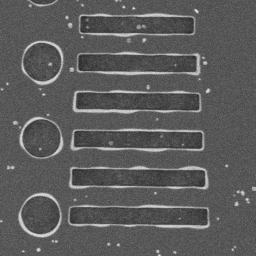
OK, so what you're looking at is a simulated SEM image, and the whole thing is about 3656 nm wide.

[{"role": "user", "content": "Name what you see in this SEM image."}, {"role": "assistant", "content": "groups of lines, slits or small figures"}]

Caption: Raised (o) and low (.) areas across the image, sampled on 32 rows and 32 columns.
oooo..oooooooooooooooooooooooooo
oooooooooooooooooooooooooooooooo
oooooooooo..............oooooooo
oooooooooo..............oooooooo
oooooooooooooooooooooooooooooooo
oooo..oooooooooooooooooooooooooo
ooo.....oooooooooooooooooooooooo
ooo.....oo...............ooooooo
ooo.....oo...............ooooooo
oooo...ooooooooooooooooooooooooo
oooooooooooooooooooooooooooooooo
oooooooooo..oo..oooooooooooooooo
ooooooooo................ooooooo
ooooooooo................ooooooo
oooooooooooooooooooooooooooooooo
ooo....ooooooooooooooooooooooooo
ooo....oo................ooooooo
ooo.....o................ooooooo
ooo....oo................ooooooo
oooo..oooooooooooooooooooooooooo
oooooooooooooooooooooooooooooooo
ooooooooo.................oooooo
ooooooooo.................oooooo
oooooooooooooooooooooooooooooooo
oooo..oooooooooooooooooooooooooo
ooo....ooooooooooooooooooooooooo
ooo....oo.................oooooo
ooo....oo.................oooooo
ooo....ooooooooooooooooooooooooo
oooooooooooooooooooooooooooooooo
oooooooooooooooooooooooooooooooo
oooooooooooooooooooooooooooooooo